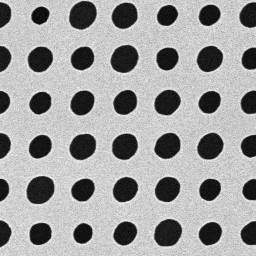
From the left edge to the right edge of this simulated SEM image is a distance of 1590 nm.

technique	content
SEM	a regular array of holes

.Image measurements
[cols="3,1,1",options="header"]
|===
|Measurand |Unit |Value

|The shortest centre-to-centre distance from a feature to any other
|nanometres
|262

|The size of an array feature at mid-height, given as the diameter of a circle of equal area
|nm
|150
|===